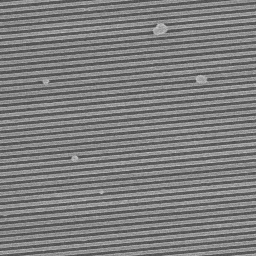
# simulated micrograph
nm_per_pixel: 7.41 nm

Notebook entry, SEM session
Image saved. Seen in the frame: parallel lines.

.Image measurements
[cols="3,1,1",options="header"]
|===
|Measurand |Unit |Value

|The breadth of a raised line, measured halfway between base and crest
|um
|0.0249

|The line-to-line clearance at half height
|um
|0.0249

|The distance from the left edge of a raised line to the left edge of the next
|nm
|48.3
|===